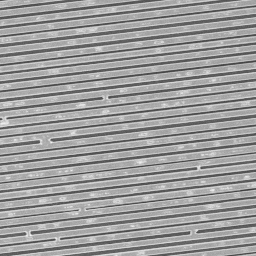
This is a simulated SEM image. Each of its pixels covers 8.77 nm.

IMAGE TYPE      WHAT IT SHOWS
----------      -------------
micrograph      parallel lines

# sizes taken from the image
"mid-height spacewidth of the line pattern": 0.0293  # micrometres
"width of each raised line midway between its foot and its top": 51.2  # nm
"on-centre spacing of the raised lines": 79.5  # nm